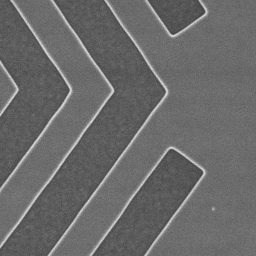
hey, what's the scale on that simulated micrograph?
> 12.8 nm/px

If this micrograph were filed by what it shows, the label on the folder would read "groups of lines, slits or small figures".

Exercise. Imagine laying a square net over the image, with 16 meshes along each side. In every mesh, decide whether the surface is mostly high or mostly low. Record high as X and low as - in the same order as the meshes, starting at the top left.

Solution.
-XXX---XXX---XXX
--XX----XX--XXXX
--XXX---XXXXXXXX
---XXX---XXXXXXX
----XX----XXXXXX
X---XXX---XXXXXX
X---XXX---XXXXXX
---XXX---XXXXXXX
--XXX---XXXXXXXX
--XX----XXXXXXXX
-XXX---XXX--XXXX
XXX---XXX---XXXX
XX----XX----XXXX
X----XXX---XXXXX
X---XXX---XXXXXX
---XXX---XXXXXXX